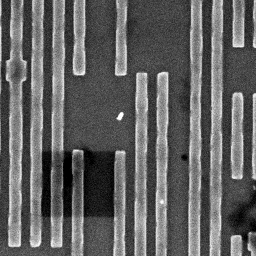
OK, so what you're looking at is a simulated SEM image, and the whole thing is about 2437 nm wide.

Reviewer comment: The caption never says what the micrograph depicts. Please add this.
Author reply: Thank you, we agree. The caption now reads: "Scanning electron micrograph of wiring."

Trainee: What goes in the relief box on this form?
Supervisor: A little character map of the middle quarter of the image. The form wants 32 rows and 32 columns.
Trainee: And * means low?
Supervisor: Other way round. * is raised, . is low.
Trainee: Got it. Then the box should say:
..***........**.................
..***........**.................
...**........**....*....**......
..................***...**......
..................***...**......
..................***...**......
..................***...**......
..................***...**......
..................***..***......
..................***..***......
..................***..***......
..................***..***......
..............*...***..***......
..................***..***......
..................***..***......
..................***..***......
..................***...**......
..................***...*.......
..................***..***......
..................***..***......
..................***..***......
..................***..***......
..***........**...**...***......
..***........**...**...***......
..***........**...**...***......
..***........**...**...***......
..***........**...**...**.......
..***........**...**...**.......
..***........**...**...**.......
..***........**...**...**.......
..***........**...**...**.......
..***........**...**...**.......